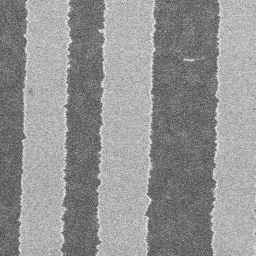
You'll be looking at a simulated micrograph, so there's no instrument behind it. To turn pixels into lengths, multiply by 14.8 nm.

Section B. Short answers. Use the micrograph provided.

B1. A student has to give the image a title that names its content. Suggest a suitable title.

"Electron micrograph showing one or a few lines or trenches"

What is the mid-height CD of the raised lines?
646 nm